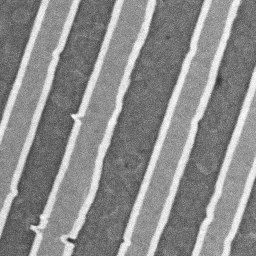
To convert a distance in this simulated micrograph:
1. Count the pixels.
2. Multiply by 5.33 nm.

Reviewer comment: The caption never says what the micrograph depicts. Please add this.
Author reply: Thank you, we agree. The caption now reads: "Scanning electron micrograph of one or a few lines or trenches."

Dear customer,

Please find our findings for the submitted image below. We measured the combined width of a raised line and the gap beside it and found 0.41 micrometres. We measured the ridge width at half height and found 153 nm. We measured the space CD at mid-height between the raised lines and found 0.228 µm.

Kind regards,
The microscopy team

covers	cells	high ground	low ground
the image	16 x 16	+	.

...++..++....++.
..++...++....+..
..++...++...++..
..++..++....++..
.++...++...++...
.++...++...++...
.++..++....++..+
++...++...++...+
++...++...++...+
++..++....++..++
+...++...++...++
+...++...++...++
+..+++...++..++.
...++...++...++.
..+++...++...++.
..++....++..++..